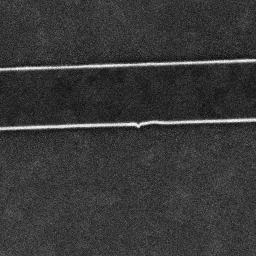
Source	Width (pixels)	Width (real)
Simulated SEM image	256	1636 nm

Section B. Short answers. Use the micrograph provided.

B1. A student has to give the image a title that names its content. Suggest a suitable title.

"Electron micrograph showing one or a few lines or trenches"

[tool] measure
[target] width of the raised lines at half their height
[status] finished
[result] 381 nm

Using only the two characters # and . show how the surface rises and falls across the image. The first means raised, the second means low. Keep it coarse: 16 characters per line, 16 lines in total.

................
................
................
................
################
################
################
################
................
................
................
................
................
................
................
................